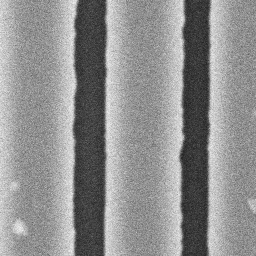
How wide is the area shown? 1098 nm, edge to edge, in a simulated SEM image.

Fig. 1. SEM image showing lines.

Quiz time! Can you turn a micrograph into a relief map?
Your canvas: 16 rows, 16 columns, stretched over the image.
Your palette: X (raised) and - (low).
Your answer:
XXXXX--XXXX--XXX
XXXXX--XXXX--XXX
XXXXX--XXXX--XXX
XXXXX--XXXX--XXX
XXXXX--XXXX--XXX
XXXXX--XXXX--XXX
XXXXX--XXXX--XXX
XXXXX--XXXX--XXX
XXXXX--XXXX--XXX
XXXXX--XXXX--XXX
XXXXX--XXXX--XXX
XXXXX--XXXX--XXX
XXXXX--XXXX--XXX
XXXXX--XXXX--XXX
XXXXX--XXXX--XXX
XXXXX--XXXX--XXX